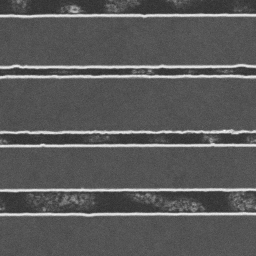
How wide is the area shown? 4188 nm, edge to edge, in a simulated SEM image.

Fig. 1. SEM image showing one or a few lines or trenches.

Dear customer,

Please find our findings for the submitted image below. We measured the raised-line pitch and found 1070 nm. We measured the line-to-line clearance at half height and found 845 nm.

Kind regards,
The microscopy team